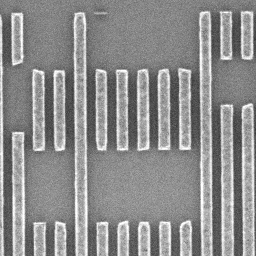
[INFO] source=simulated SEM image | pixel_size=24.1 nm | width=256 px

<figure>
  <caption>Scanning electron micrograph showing wiring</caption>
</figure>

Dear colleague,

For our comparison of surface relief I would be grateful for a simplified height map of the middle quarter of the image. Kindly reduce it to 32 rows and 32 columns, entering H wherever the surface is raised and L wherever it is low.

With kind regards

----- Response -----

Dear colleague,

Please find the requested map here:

LLLHHLLLLLLLLLLLLLLLLLLLLLLLLLLL
LLLHHLLLLLLLLLLLLLLLLLLLLLLLLHLL
LLLHHLLLHHLLLHHHLLLHHLLLHHLLLHHH
LLLHHLLLHHLLLHHHLLLHHLLLHHLLLHHH
LLLHHLLLHHLLLHHHLLLHHLLLHHLLLHHL
LLLHHLLLHHLLLHHHLLLHHLLLHHLLLHHL
LLLHHLLLHHLLLHHHLLLHHLLLHHLLLHHH
LLLHHLLLHHLLLHHHLLLHHLLLHHLLLHHH
LLLHHLLLHHLLLHHHLLLHHLLLHHLLLHHH
LLLHHLLLHHLLLHHHLLLHHLLLHHLLLHHH
LLLHHLLLHHLLLHHHLLLHHLLLHHLLLHHH
LLLHHLLLHHLLLHHHLLLHHLLLHHLLLHHH
LLLHHLLLHHLLLHHHLLLHHLLLHHLLLHHH
LLLHHLLLHHLLLHHHLLLHHLLLHHLLLHHH
LLLHHLLLHHLLLHHHLLLHHLLLHHLLLHHH
LLLHHLLLHHLLLHHHLLLHHLLLHHLLLHHH
LLLHHLLLHHLLLHHHLLLHHLLLHHLLLHHH
LLLHHLLLHHLLLHHHLLLHHLLLHHLLLHHH
LLLHHLLLHHLLLHHHLLLHHLLLHHLLLHHH
LLLHHHLLHHLLLHHHLLLHHLLLHHLLLHHH
LLLHHHLLLHLLLHHHLLLHHLLLHHLLLHHH
LLLHHHLLLLLLLLLLLLLLLLLLLLLLLLLL
LLLHHHLLLLLLLLLLLLLLLLLLLLLLLLLL
LLLHHHLLLLLLLLLLLLLLLLLLLLLLLLLL
LLLHHHLLLLLLLLLLLLLLLLLLLLLLLLLL
LLLHHHLLLLLLLLLLLLLLLLLLLLLLLLLL
LLLHHHLLLLLLLLLLLLLLLLLLLLLLLLLL
LLLHHHLLLLLLLLLLLLLLLLLLLLLLLLLL
LLLHHHLLLLLLLLLLLLLLLLLLLLLLLLLL
LLLHHHLLLLLLLLLLLLLLLLLLLLLLLLLL
LLLHHHLLLLLLLLLLLLLLLLLLLLLLLLLL
LLLHHHLLLLLLLLLLLLLLLLLLLLLLLLLL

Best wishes